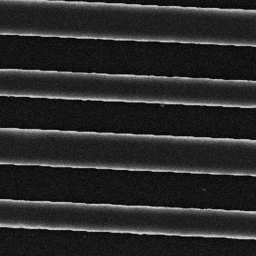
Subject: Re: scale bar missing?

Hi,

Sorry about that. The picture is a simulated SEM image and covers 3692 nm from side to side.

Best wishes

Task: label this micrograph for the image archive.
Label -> lines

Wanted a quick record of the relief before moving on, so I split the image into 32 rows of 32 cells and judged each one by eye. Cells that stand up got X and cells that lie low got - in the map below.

XXXXXXXXXXXXXXXX----------------
XXXXXXXXXXXXXXXXXXXXXXXXXXXXXXXX
XXXXXXXXXXXXXXXXXXXXXXXXXXXXXXXX
XXXXXXXXXXXXXXXXXXXXXXXXXXXXXXXX
-----XXXXXXXXXXXXXXXXXXXXXXXXXXX
---------------------------XXXXX
--------------------------------
--------------------------------
--------------------------------
XXXXXXXXXXXXXXXXXX--------------
XXXXXXXXXXXXXXXXXXXXXXXXXXXXXXXX
XXXXXXXXXXXXXXXXXXXXXXXXXXXXXXXX
-------------XXXXXXXXXXXXXXXXXXX
--------------------------------
--------------------------------
--------------------------------
XXXXXXXXX-----------------------
XXXXXXXXXXXXXXXXXXXXXXXXXXXXXXX-
XXXXXXXXXXXXXXXXXXXXXXXXXXXXXXXX
XXXXXXXXXXXXXXXXXXXXXXXXXXXXXXXX
--XXXXXXXXXXXXXXXXXXXXXXXXXXXXXX
---------------------XXXXXXXXXXX
--------------------------------
--------------------------------
--------------------------------
XXXXXXXXXXX---------------------
XXXXXXXXXXXXXXXXXXXXXXXXXXXXXXXX
XXXXXXXXXXXXXXXXXXXXXXXXXXXXXXXX
-----XXXXXXXXXXXXXXXXXXXXXXXXXXX
-------------------------XXXXXXX
--------------------------------
--------------------------------